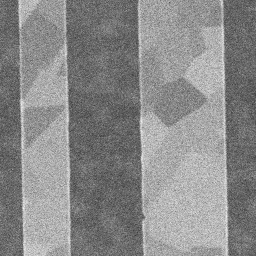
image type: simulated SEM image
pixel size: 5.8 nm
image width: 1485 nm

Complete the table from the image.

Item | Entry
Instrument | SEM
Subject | one or a few lines or trenches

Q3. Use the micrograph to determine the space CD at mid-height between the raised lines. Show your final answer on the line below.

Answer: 73.7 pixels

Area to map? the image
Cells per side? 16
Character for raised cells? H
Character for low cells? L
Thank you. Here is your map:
LHHHLLLLLHHHHHLL
LHHHLLLLLHHHHHLL
LHHHLLLLLHHHHHLL
LHHHLLLLLHHHHHLL
LHHHLLLLLHHHHHLL
LHHHLLLLLHHHHHLL
LHHHLLLLLHHHHHLL
LHHHLLLLLHHHHHLL
LHHHLLLLLHHHHHLL
LHHHLLLLLHHHHHLL
LHHHLLLLLHHHHHLL
LHHHLLLLLHHHHHLL
LHHHLLLLLHHHHHLL
LHHHLLLLLHHHHHLL
LHHHLLLLLHHHHHLL
LHHHLLLLLHHHHHLL